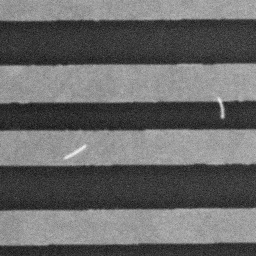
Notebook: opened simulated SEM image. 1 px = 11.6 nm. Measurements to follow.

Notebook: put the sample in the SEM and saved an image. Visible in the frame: lines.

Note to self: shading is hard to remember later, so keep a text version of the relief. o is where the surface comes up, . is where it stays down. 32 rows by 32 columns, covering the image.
oooooooooooooooooooooooooooooooo
oooooooooooooooooooooooooooooooo
ooooooo....oo...................
................................
................................
................................
................................
................................
oooooooooooooooooooooooooooooooo
oooooooooooooooooooooooooooooooo
oooooooooooooooooooooooooooooooo
oooooooooooooooooooooooooooooooo
ooooooooooooooooooooooooooooo.o.
................................
................................
................................
oooooooooooooooooooooooooooooooo
oooooooooooooooooooooooooooooooo
oooooooooooooooooooooooooooooooo
oooooooooooooooooooooooooooooooo
oooooooooooooo..................
................................
................................
................................
................................
................................
oooooooooooooooooooooooooooooooo
oooooooooooooooooooooooooooooooo
oooooooooooooooooooooooooooooooo
oooooooooooooooooooooooooooooooo
oooooo..........................
................................